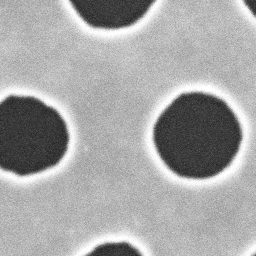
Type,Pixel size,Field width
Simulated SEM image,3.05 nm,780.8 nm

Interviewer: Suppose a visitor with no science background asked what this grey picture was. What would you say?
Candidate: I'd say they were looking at holes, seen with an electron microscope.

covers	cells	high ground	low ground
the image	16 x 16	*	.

*****....******.
*****...********
****************
****************
****************
****************
...********...**
....******.....*
....******.....*
....******.....*
...*******....**
****************
****************
****************
****************
******...*******